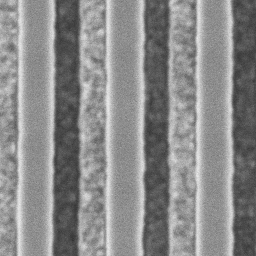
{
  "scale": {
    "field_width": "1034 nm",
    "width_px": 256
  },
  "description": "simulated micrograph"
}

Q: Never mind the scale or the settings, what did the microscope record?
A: lines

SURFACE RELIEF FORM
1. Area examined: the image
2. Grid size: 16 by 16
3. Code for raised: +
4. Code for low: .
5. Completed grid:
+++..++++..+++..
+++..++++..+++..
+++..++++..+++..
+++..++++..++++.
+++..++++..+++..
+++..++++..+++..
+++..++++..+++..
+++..++++..+++..
+++..++++..+++..
+++..++++..++++.
+++..++++..++++.
+++..++++..+++..
+++..++++..++++.
+++..++++..++++.
+++..++++..++++.
+++..++++..++++.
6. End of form